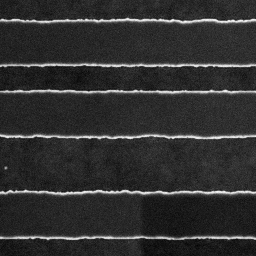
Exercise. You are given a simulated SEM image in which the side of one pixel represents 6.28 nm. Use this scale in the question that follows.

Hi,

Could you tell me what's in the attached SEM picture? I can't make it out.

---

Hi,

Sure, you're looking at lines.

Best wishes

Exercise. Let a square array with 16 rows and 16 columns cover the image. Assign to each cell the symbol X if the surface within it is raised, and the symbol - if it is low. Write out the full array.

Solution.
----------------
XXXXXXXXXXXXXXXX
XXXXXXXXXXXXXXXX
XXXXXXXXXXXXXXXX
----------------
----------------
XXXXXXXXXXXXXXXX
XXXXXXXXXXXXXXXX
XXXXXXXXXXXXXXXX
----------------
----------------
----------------
XXXXXXXXXXXXXXXX
XXXXXXXXXXXXXXXX
XXXXXXXXXXXXXXXX
----------------